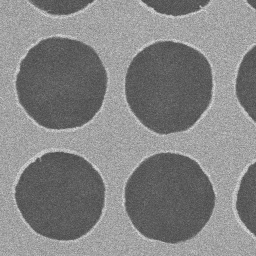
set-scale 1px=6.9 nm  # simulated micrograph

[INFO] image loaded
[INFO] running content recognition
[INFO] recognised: holes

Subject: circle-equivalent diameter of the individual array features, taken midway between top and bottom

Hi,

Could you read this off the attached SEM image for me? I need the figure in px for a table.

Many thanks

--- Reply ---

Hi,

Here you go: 90.1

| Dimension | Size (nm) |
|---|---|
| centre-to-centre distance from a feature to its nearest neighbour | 744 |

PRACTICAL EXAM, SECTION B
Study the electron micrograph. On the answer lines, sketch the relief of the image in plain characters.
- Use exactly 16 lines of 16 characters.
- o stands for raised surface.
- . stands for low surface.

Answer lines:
oo...oooo....ooo
oooooooooooooooo
ooo..ooooooooooo
oo....ooo....oo.
o......o.....oo.
o......o.....oo.
o.....oo.....oo.
oo....ooo...oooo
oooooooooooooooo
oooooooooooooooo
oo....ooo....ooo
o.....oo.....oo.
o......o.....oo.
o.....oo.....oo.
oo...oooo...oooo
oooooooooooooooo